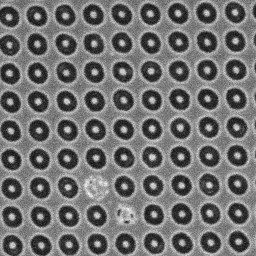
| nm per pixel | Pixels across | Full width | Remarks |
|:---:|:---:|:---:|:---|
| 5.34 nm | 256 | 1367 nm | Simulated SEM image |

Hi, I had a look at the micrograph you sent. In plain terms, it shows a regular array of ring-shaped grooves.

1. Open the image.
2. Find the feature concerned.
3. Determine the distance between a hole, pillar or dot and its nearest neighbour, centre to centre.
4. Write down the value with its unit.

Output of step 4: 0.149 um